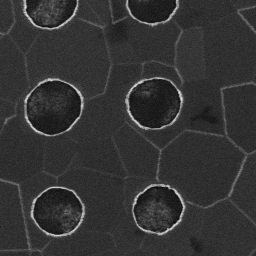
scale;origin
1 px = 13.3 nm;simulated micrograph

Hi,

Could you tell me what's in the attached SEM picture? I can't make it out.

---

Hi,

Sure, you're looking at holes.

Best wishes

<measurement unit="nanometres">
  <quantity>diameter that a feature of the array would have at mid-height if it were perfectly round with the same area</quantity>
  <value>666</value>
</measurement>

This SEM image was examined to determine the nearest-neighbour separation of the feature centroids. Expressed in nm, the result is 1340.